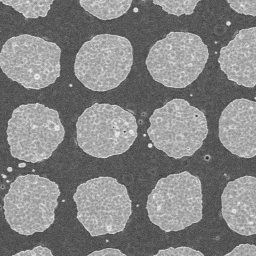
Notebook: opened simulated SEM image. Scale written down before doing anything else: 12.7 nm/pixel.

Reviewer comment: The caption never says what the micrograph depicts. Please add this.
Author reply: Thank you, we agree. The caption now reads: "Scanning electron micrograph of a regular array of raised bodies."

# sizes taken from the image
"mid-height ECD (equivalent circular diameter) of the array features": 718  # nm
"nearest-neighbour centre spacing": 0.899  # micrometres